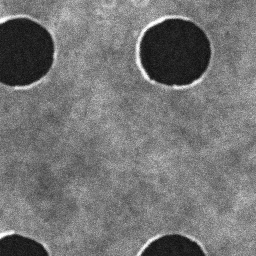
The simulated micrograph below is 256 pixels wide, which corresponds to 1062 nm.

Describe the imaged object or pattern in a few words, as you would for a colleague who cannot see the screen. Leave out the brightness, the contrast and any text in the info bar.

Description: holes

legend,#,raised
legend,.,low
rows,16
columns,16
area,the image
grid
################
..########..####
...######....###
...######....###
...######....###
################
################
################
################
################
################
################
################
################
################
...######....###